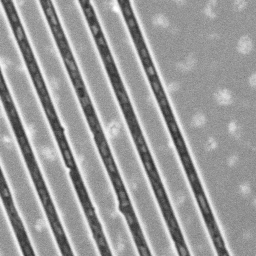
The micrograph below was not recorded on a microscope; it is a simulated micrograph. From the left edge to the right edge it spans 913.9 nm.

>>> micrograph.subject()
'parallel lines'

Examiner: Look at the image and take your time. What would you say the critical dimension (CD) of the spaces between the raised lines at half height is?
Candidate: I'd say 42.4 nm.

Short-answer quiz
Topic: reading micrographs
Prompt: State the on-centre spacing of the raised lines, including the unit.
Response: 129 nm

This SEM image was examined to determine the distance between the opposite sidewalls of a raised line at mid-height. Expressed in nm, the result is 88.1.